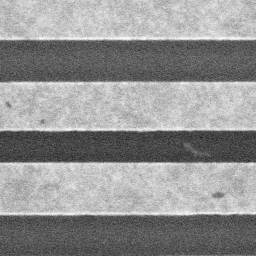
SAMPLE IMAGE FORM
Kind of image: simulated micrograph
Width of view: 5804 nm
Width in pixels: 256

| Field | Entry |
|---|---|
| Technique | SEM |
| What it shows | lines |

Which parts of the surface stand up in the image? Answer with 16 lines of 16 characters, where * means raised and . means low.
****************
****************
................
................
................
****************
****************
****************
................
................
****************
****************
****************
................
................
................